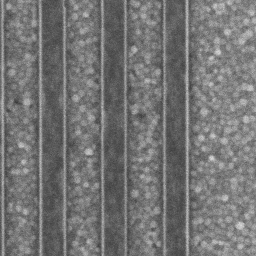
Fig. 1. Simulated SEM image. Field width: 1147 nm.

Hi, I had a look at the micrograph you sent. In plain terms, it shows one or a few lines or trenches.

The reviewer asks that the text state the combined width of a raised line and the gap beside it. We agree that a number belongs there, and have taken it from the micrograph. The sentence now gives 61.8 pixels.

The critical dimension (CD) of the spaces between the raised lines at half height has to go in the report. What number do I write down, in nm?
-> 165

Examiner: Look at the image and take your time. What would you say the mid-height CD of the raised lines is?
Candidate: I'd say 108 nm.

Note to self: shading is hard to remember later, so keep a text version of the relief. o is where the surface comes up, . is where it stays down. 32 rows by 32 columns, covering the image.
.....ooo.....ooo.....oo.........
.....ooo.....ooo....ooo.........
.....ooo.....ooo....ooo.........
.....ooo.....ooo....ooo.........
.....ooo.....ooo....ooo.........
.....ooo.....ooo.....oo.........
.....ooo.....ooo.....oo.........
.....ooo.....ooo.....oo.........
.....ooo.....ooo.....oo.........
.....ooo.....ooo.....oo.........
.....ooo.....ooo.....oo.........
.....ooo.....ooo.....oo.........
.....ooo.....ooo.....oo.........
.....ooo.....ooo.....oo.........
.....ooo.....ooo.....oo.........
.....ooo.....ooo.....oo.........
.....ooo.....ooo.....oo.........
.....ooo.....ooo.....oo.........
.....ooo.....ooo.....oo.........
.....ooo.....ooo.....oo.........
.....ooo.....ooo.....oo.........
.....ooo.....ooo.....oo.........
.....ooo.....ooo.....oo.........
.....ooo.....ooo.....oo.........
.....ooo.....ooo.....oo.........
.....ooo.....ooo.....oo.........
.....ooo.....ooo.....oo.........
.....ooo.....ooo.....oo.........
.....ooo.....ooo.....oo.........
.....ooo.....ooo.....oo.........
.....ooo.....ooo.....oo.........
.....ooo.....ooo.....oo.........